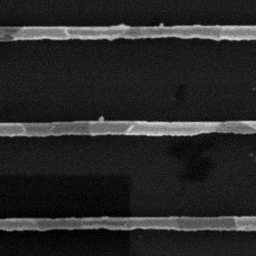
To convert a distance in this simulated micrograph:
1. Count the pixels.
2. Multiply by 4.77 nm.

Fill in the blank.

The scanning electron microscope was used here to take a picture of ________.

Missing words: lines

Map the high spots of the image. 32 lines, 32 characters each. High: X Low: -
--------------------------------
--------------------------------
--------------------------------
XXXXXXXXXXXXXXXXXXXXXXXXXXXXXXXX
XXXXXXXXXXXXXXXXXXXXXXXXXXXXXXXX
--------------------------------
--------------------------------
--------------------------------
--------------------------------
--------------------------------
--------------------------------
--------------------------------
--------------------------------
--------------------------------
--------------------------------
XXXXXXXXXXXXXXXXXXXXXXXXXXXXXXXX
XXXXXXXXXXXXXXXXXXXXXXXXXXXXXXXX
--------------------------------
--------------------------------
--------------------------------
--------------------------------
--------------------------------
--------------------------------
--------------------------------
--------------------------------
--------------------------------
--------------------------------
XXXXXXXXXXXXXXXXXXXXXXXXXXXXXXXX
XXXXXXXXXXXXXXXXXXXXXXXXXXXXXXXX
--------------------------------
--------------------------------
--------------------------------